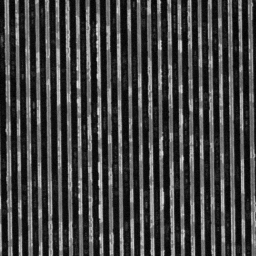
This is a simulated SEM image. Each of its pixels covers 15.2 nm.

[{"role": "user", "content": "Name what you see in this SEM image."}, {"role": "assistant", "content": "parallel lines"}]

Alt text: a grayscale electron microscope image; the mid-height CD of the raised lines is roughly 43.8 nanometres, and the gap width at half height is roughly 103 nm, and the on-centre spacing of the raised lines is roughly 0.155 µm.